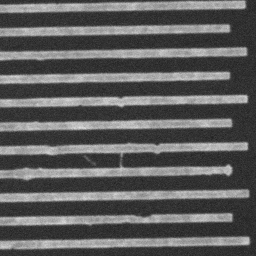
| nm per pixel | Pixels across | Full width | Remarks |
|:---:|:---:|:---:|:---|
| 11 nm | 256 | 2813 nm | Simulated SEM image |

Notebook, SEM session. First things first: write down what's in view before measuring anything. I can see parallel lines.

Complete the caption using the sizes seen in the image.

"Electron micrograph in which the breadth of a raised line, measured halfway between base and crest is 75.6 nm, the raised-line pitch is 0.26 microns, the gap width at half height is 182 nm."